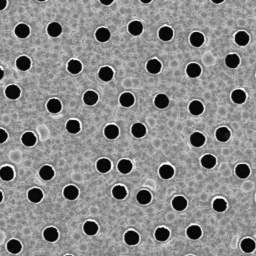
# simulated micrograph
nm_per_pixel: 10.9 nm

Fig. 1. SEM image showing a regular array of holes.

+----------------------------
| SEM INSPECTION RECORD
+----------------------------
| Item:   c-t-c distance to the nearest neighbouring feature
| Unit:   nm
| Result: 339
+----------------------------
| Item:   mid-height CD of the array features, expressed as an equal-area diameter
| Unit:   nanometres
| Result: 164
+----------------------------